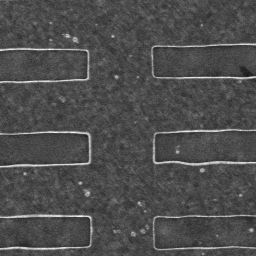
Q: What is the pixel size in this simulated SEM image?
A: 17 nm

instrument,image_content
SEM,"groups of lines, slits or small figures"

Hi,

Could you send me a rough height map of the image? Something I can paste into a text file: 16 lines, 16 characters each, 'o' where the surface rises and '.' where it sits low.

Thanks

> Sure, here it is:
oooooooooooooooo
oooooooooooooooo
oooooooooooooooo
.....ooooo......
.....ooooo......
oooooooooooooooo
oooooooooooooooo
oooooooooooooooo
.....ooooo......
......oooo......
oooooooooooooooo
oooooooooooooooo
oooooooooooooooo
o....ooooooo....
......oooo......
.....ooooo....oo